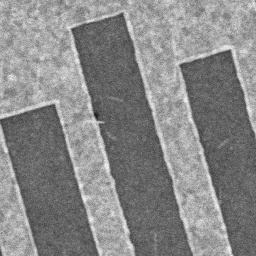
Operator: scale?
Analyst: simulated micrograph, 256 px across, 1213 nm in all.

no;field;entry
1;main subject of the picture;one or a few lines or trenches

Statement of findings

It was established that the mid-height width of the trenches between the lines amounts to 0.275 micrometres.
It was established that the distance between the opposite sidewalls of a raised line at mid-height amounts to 168 nm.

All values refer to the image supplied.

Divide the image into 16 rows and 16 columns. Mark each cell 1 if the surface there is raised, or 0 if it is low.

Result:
1111111111111111
1111100011111111
1111100011111111
1111100001111001
1111100001100001
1111100001110001
1111110001110001
0000110000110000
0000110000110000
0000111000111000
1000011000011000
1000011000011000
1000011000011000
1100001100011100
1100001100001100
1100001100001100